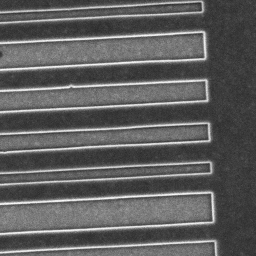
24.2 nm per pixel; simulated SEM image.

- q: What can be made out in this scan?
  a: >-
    parallel lines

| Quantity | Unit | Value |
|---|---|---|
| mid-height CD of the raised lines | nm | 510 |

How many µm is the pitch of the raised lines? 1.01